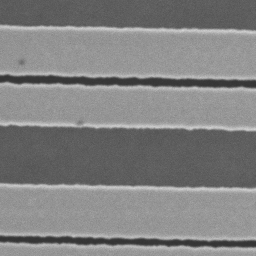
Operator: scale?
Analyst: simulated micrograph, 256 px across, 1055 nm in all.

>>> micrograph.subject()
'lines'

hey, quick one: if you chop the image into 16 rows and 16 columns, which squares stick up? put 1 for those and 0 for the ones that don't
0000000000000000
0000000000000000
1111111111111111
1111111111111111
1111111111111111
1111111111111111
1111111111111111
1111111111111111
0000000000000000
0000000000000000
0000000000000000
1000000000000000
1111111111111111
1111111111111111
1111111111111111
1111111111111111